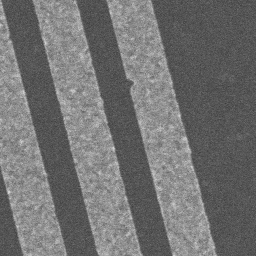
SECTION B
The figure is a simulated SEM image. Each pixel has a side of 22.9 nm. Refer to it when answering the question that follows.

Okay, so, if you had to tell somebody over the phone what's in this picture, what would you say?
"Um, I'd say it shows one or a few lines or trenches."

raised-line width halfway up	930	nanometres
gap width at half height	714	nanometers